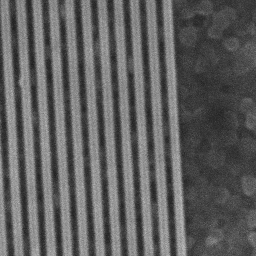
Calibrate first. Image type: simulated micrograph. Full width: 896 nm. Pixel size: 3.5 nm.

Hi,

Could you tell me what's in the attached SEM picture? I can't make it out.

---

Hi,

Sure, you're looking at parallel lines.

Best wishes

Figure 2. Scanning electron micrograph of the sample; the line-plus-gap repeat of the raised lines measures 56.8 nm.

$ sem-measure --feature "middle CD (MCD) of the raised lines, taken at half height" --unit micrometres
0.0236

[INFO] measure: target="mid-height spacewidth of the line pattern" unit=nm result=33.6